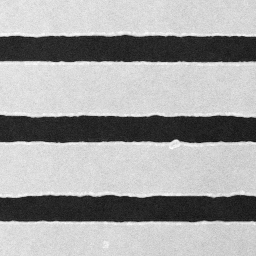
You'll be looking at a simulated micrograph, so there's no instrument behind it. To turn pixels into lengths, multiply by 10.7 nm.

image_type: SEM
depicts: lines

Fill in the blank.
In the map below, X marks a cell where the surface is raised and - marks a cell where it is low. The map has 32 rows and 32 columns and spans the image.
XXXXXXXXXXXXXXXXXXXXXXXXXXXXXXXX
XXXXXXXXXXXXXXXXXXXXXXXXXXXXXXXX
XXXXXXXXXXXXXXXXXXXXXXXXXXXXXXXX
XXXXXXXXXXXXXXXXXXXXXXXXXXXXXXXX
XXXXXXXXXX---XX-XX--XXXXXXXXXXXX
--------------------------------
--------------------------------
--------------------------------
XXXXXXXXXXXXXXXXXXXXXXXXXXXXXXXX
XXXXXXXXXXXXXXXXXXXXXXXXXXXXXXXX
XXXXXXXXXXXXXXXXXXXXXXXXXXXXXXXX
XXXXXXXXXXXXXXXXXXXXXXXXXXXXXXXX
XXXXXXXXXXXXXXXXXXXXXXXXXXXXXXXX
XXXXXXXXXXXXXXXXXXXXXXXXXXXXXXXX
---XXXXXXX---XXXXXX-XXXXXXX--XXX
--------------------------------
--------------------------------
--------------------------------
XXXXXXXXXXXXXXXXXXXXXXXXXXXXXXXX
XXXXXXXXXXXXXXXXXXXXXXXXXXXXXXXX
XXXXXXXXXXXXXXXXXXXXXXXXXXXXXXXX
XXXXXXXXXXXXXXXXXXXXXXXXXXXXXXXX
XXXXXXXXXXXXXXXXXXXXXXXXXXXXXXXX
XXXXXXXXXXXXXXXXXXXXXXXXXXXXXXXX
XXXX-----X-XX--XXXX-------XXX--X
--------------------------------
--------------------------------
--------------------------------
XXXXXXXXXXXXXXXXXXXXXXXXXXXXXXXX
XXXXXXXXXXXXXXXXXXXXXXXXXXXXXXXX
XXXXXXXXXXXXXXXXXXXXXXXXXXXXXXXX
XXXXXXXXXXXXXXXXXXXXXXXXXXXXXXXX